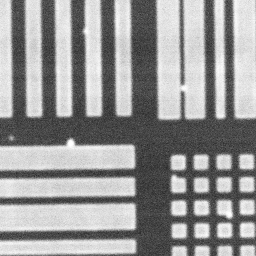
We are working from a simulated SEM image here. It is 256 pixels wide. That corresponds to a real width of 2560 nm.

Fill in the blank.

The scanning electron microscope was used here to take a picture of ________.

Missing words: groups of lines, slits or small figures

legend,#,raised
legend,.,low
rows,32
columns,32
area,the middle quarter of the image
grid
#.....###....####.......#####.##
#.....###....####.......#####.##
#.....###....####.......#####..#
#.....###....####.......#####..#
#.....###....####.......#####..#
##....###....####.......#####.##
#.....###....####.......#####.##
#.....###....####.......#####..#
#.....###....####.......#####..#
#.....###....####.......#####..#
##....###....####.......#####..#
##....###....####.......#####..#
##....###....####.......#####..#
........................#####..#
................................
................................
................................
................................
................................
................................
.#..............................
#################...............
#################...............
#################..........###..
#################..........###..
#################..........###..
................................
................................
................................
#################..........###..
#################..........###..
#################..........###..